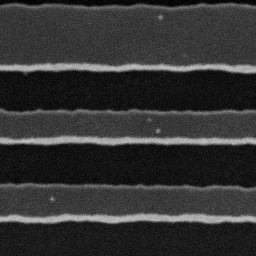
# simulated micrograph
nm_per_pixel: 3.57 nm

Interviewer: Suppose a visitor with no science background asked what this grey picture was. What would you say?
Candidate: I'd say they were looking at lines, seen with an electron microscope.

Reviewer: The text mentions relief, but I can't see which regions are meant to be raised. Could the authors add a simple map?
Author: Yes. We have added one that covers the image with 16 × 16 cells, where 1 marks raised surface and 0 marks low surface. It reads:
1111111111111111
1111111111111111
1111111111111111
1111111111111111
0000000000000001
0000000000000000
0000000000000000
1111111111111111
1111111111111111
0000000000000000
0000000000000000
0100000000000000
1111111111111111
1111111111111111
0000000000000000
0000000000000000